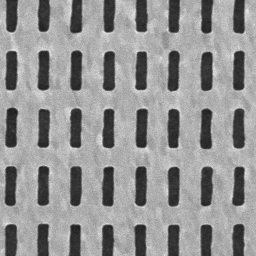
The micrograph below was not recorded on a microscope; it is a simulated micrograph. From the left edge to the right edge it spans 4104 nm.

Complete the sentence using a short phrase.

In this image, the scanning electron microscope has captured a regular array of holes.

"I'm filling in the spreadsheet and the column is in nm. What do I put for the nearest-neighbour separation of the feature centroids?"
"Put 517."